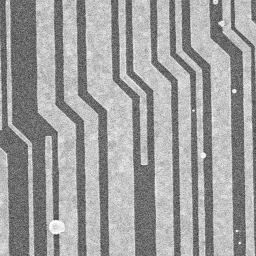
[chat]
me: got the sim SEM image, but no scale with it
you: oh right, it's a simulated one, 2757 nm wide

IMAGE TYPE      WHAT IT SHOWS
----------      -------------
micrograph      groups of lines, slits or small figures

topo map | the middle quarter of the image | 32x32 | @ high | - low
@@@---@@@@@@--@---@@@@---@@@@---
@@@---@@@@@@--@---@@@@@---@@@@--
@@@---@@@@@@--@@--@@@@@@---@@@@-
@@@---@@@@@@--@@---@@@@@@---@@@-
@@@---@@@@@@---@@---@@@@@@---@@-
@@@---@@@@@@@---@@---@@@@@@--@@-
@@@---@@@@@@@@----@@--@@@@@--@@-
@@@----@@@@@@@@---@@---@@@@--@@-
@@@@----@@@@@@@@---@---@@@@--@@-
@@@@@---@@@@@@@@@--@---@@@@--@@-
-@@@@@----@@@@@@@--@@--@@@@--@@-
--@@@@@----@@@@@@--@@--@@@@--@@-
---@@@@@---@@@@@@--@@--@@@@--@@-
@----@@@---@@@@@@--@@--@@@@--@@-
@@---@@@---@@@@@@--@@--@@@@--@@-
@@@--@@@---@@@@@@--@@--@@@@--@@-
@@@--@@@---@@@@@@--@@--@@@@--@@-
@@@--@@@---@@@@@@--@@--@@@@--@@-
@@@--@@@---@@@@@@--@@--@@@@--@@-
@@@--@@@---@@@@@@--@@--@@@@--@@-
@@@--@@@---@@@@@@--@@--@@@@--@@-
@@@--@@@---@@@@@@--@@--@@@@--@@-
@@@--@@@---@@@@@@--@@--@@@@--@@@
@@@--@@@---@@@@@@--@@--@@@@--@@@
@@@--@@@---@@@@@@--@@--@@@@--@@@
@@@--@@@---@@@@@@------@@@@--@@@
@@@--@@@---@@@@@@------@@@@--@@@
@@@---@@---@@@@@@------@@@@--@@@
@@@---@@---@@@@@@------@@@@--@@@
@@@---@@@--@@@@@@------@@@@--@@@
@@@---@@@--@@@@@@------@@@@--@@@
@@@---@@@--@@@@@@------@@@@--@@@